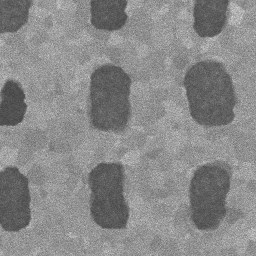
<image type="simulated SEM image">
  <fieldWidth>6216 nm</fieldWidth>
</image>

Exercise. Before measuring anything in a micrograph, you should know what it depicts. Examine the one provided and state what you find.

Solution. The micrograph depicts holes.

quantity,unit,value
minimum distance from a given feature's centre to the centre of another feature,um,2.41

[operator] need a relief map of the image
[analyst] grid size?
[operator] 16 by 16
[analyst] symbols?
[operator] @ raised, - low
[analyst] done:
--@@@@--@@@@--@@
-@@@@@--@@@@--@@
@@@@@@@@@@@@@@@@
@@@@@@@@@@@@@@@@
@@@@@@--@@@@--@@
-@@@@@--@@@@---@
--@@@---@@@@---@
-@@@@@--@@@@--@@
@@@@@@@@@@@@@@@@
@@@@@@@@@@@@@@@@
-@@@@@--@@@@--@@
--@@@@--@@@@--@@
--@@@@--@@@@--@@
--@@@@--@@@@--@@
@@@@@@@@@@@@@@@@
@@@@@@@@@@@@@@@@